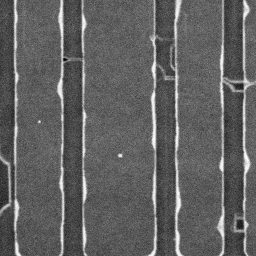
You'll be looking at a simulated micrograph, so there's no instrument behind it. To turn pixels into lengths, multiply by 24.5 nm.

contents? wiring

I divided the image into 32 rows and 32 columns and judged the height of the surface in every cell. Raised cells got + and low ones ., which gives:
..++++++..+++++++++...++++++...+
..++++++..+++++++++...++++++...+
..++++++..+++++++++...++++++..++
..++++++..+++++++++...++++++..++
..++++++..+++++++++...++++++..++
..++++++..+++++++++...++++++..++
..++++++..+++++++++...++++++...+
..++++++..+++++++++...++++++...+
..++++++..+++++++++...++++++...+
..++++++..+++++++++...++++++...+
..++++++..+++++++++...++++++...+
..++++++..+++++++++...++++++...+
..++++++..+++++++++...++++++..++
..++++++..+++++++++...++++++..++
..++++++...++++++++...++++++..++
..++++++..+++++++++...++++++...+
..++++++..+++++++++...++++++..++
..++++++..+++++++++...++++++..++
..++++++..+++++++++...++++++...+
..++++++..+++++++++...++++++...+
..++++++..+++++++++...++++++...+
..++++++..+++++++++...++++++...+
..++++++...++++++++...++++++...+
..++++++...++++++++...++++++...+
..++++++...++++++++...++++++...+
..++++++..+++++++++...++++++...+
..++++++..+++++++++...++++++...+
..++++++..+++++++++...++++++...+
..++++++..+++++++++...++++++...+
..++++++...++++++++...++++++...+
..++++++...++++++++...++++++...+
..++++++...++++++++...++++++...+